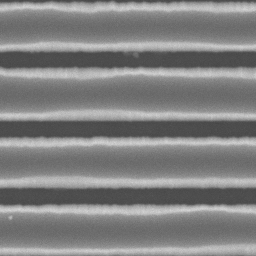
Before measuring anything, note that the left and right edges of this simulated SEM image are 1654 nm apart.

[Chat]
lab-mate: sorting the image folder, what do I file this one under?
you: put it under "lines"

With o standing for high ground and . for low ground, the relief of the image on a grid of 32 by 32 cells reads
.oooooo..o..oo..oo....oo........
oooooooooooooooooooooooooooooooo
oooooooooooooooooooooooooooooooo
oooooooooooooooooooooooooooooooo
oooooooooooooooooooooooooooooooo
oooooooooooooooooooooooooooooooo
................................
................................
................................
oooooooooooooooooooooooooooooooo
oooooooooooooooooooooooooooooooo
oooooooooooooooooooooooooooooooo
oooooooooooooooooooooooooooooooo
oooooooooooooooooooooooooooooooo
oooooooooooooooooooooooooooooooo
................................
................................
oooo.ooooooooooooooooooooooooooo
oooooooooooooooooooooooooooooooo
oooooooooooooooooooooooooooooooo
oooooooooooooooooooooooooooooooo
oooooooooooooooooooooooooooooooo
oooooooooooooooooooooooooooooooo
................................
................................
................................
oooooooooooooooooooooooooooooooo
oooooooooooooooooooooooooooooooo
oooooooooooooooooooooooooooooooo
oooooooooooooooooooooooooooooooo
oooooooooooooooooooooooooooooooo
oooooooooooooooooooooooooooooooo